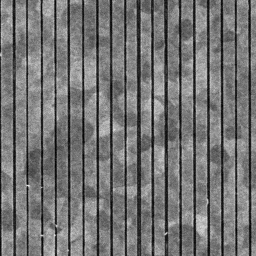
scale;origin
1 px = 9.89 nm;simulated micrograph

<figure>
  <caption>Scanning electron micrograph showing parallel lines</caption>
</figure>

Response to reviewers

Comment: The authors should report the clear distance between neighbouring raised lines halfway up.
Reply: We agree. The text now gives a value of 27.2 nm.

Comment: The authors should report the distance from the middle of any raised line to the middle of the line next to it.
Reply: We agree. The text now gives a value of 137 nm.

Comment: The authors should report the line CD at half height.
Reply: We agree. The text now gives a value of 111 nanometers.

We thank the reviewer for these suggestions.